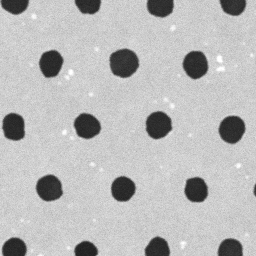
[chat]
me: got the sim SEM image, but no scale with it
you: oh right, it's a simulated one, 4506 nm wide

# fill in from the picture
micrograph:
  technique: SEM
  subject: a regular array of holes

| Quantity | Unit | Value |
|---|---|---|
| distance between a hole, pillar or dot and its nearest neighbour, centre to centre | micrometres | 1.25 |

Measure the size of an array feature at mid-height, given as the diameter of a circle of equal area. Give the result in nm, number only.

470